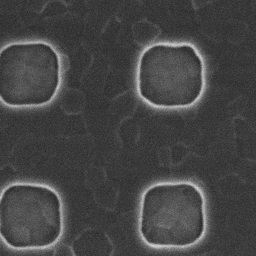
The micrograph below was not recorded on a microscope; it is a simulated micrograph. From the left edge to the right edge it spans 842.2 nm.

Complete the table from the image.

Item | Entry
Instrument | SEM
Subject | holes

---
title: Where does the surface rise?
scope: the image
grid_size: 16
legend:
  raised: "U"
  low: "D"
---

UUUUUUUUUUUUUUUU
UUUUUUUUUUUUUUUU
UUUUUUUUUUUUUUUU
DDDDUUUUUDDDUUUU
DDDDUUUUUDDDDUUU
DDDDUUUUUDDDDUUU
UDUUUUUUUUDDUUUU
UUUUUUUUUUUUUUUU
UUUUUUUUUUUUUUUU
UUUUUUUUUUUUUUUU
UUUUUUUUUUUUUUUU
UUUUUUUUUUUUUUUU
DDDDUUUUUDDDDUUU
DDDDUUUUUDDDDUUU
DDDDUUUUUDDDDUUU
UUUUUUUUUUUUUUUU